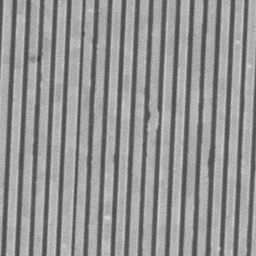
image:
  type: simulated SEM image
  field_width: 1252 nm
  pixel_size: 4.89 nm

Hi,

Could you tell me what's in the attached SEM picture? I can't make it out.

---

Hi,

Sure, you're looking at parallel lines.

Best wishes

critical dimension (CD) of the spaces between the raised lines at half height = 29.3 nm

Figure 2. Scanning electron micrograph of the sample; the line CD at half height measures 37.9 nm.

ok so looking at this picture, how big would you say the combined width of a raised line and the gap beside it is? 66.5 nm